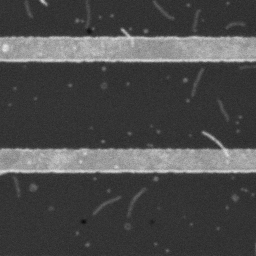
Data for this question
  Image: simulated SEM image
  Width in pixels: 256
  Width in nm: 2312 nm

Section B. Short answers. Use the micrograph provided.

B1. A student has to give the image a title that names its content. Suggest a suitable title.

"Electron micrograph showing lines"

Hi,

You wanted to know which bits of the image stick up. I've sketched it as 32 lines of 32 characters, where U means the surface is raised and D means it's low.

DDDDDDDDDDDDDDDDDDDDDDDDDDDDDDDD
DDDDDDDDDDDDDDDDDDDDDDDDDDDDDDDD
DDDDDDDDDDDDDDDDDDDDDDDDDDDDDDDD
DDDDDDDDDDDDDDDDDDDDDDDDDDDDDDDD
DDDDDDDDDDDDDDDDDDDDDDDDDDDDDDDD
UUUUUUUUUUUUUUUUUUUUUUUUUUUUUUUU
UUUUUUUUUUUUUUUUUUUUUUUUUUUUUUUU
UUUUUUUUUUUUUUUUUUUUUUUUUUUUUUUU
DDDDDDDDDDDDDDDDDDDDDDDDDDDDDDDD
DDDDDDDDDDDDDDDDDDDDDDDDDDDDDDDD
DDDDDDDDDDDDDDDDDDDDDDDDDDDDDDDD
DDDDDDDDDDDDDDDDDDDDDDDDDDDDDDDD
DDDDDDDDDDDDDDDDDDDDDDDDDDDDDDDD
DDDDDDDDDDDDDDDDDDDDDDDDDDDDDDDD
DDDDDDDDDDDDDDDDDDDDDDDDDDDDDDDD
DDDDDDDDDDDDDDDDDDDDDDDDDDDDDDDD
DDDDDDDDDDDDDDDDDDDDDDDDDDDDDDDD
DDDDDDDDDDDDDDDDDDDDDDDDDDDDDDDD
DDDDDDDDDDDDDDDDDDDDDDDDDDDDDDDD
UUUUUUUUUUUUUUUUUUUUUUUUUUUUUUUU
UUUUUUUUUUUUUUUUUUUUUUUUUUUUUUUU
DDDUDUDDDUDUDDDDDDDDUDDDDDDDDDDD
DDDDDDDDDDDDDDDDDDDDDDDDDDDDDDDD
DDDDDDDDDDDDDDDDDDDDDDDDDDDDDDDD
DDDDDDDDDDDDDDDDDDDDDDDDDDDDDDDD
DDDDDDDDDDDDDDDDDDDDDDDDDDDDDDDD
DDDDDDDDDDDDDDDDDDDDDDDDDDDDDDDD
DDDDDDDDDDDDDDDDDDDDDDDDDDDDDDDD
DDDDDDDDDDDDDDDDDDDDDDDDDDDDDDDD
DDDDDDDDDDDDDDDDDDDDDDDDDDDDDDDD
DDDDDDDDDDDDDDDDDDDDDDDDDDDDDDDD
DDDDDDDDDDDDDDDDDDDDDDDDDDDDDDDD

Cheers